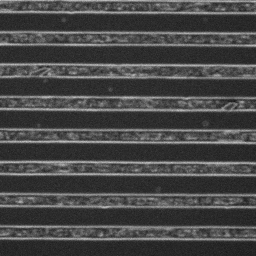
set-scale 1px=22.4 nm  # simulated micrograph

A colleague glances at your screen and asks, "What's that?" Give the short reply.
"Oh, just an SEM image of parallel lines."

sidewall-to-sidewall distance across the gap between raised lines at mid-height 0.258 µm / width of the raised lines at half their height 473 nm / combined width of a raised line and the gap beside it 725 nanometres